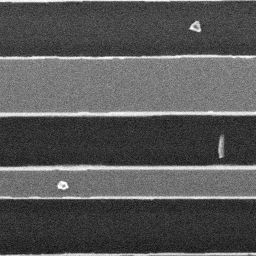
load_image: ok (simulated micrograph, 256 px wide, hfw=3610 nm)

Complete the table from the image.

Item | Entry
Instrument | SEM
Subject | lines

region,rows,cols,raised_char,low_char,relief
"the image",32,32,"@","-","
--------------------------------
--------------------------------
--------------------------------
--------------------------------
--------------------------------
--------------------------------
--------------------------------
@@@@@@@@@@@@@@@@@@@@@@@@@@@@@@@@
@@@@@@@@@@@@@@@@@@@@@@@@@@@@@@@@
@@@@@@@@@@@@@@@@@@@@@@@@@@@@@@@@
@@@@@@@@@@@@@@@@@@@@@@@@@@@@@@@@
@@@@@@@@@@@@@@@@@@@@@@@@@@@@@@@@
@@@@@@@@@@@@@@@@@@@@@@@@@@@@@@@@
@@@@@@@@@@@@@@@@@@@@@@@@@@@@@@@@
--------------------------------
--------------------------------
--------------------------------
--------------------------------
--------------------------------
--------------------------------
--------------------------------
@@@@@@@@@@@@@@@@@@@@@@@@@@@@@@@@
@@@@@@@@@@@@@@@@@@@@@@@@@@@@@@@@
@@@@@@@@@@@@@@@@@@@@@@@@@@@@@@@@
@@@@@@@@@@@@@@@@@@@@@@@@@@@@@@@@
--------------------------------
--------------------------------
--------------------------------
--------------------------------
--------------------------------
--------------------------------
--------------------------------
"